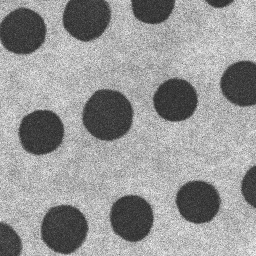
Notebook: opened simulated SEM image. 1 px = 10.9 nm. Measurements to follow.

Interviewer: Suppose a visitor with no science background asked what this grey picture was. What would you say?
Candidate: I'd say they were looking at holes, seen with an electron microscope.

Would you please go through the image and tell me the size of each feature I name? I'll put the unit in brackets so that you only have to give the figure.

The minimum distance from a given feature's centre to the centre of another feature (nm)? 749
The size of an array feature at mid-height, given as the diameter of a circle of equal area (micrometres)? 0.5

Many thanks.